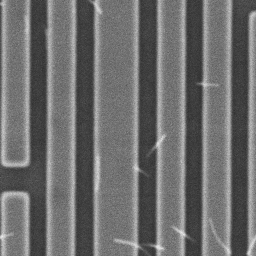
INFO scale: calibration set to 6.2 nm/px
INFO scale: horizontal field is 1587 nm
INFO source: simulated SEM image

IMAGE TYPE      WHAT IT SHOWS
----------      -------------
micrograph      groups of lines, slits or small figures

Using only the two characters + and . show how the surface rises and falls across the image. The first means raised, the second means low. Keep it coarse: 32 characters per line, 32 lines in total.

++++..+++...+++++...+++..++++...
++++..+++...+++++...+++..++++...
++++..+++...+++++...+++..++++..+
++++..+++...+++++...+++..++++..+
++++..+++...+++++...+++..++++..+
++++..+++...+++++...+++..++++..+
++++..+++...+++++...+++..++++..+
++++..+++...+++++...+++..++++..+
++++..+++...+++++...+++..++++..+
++++..+++...+++++...+++..++++..+
++++..+++...+++++...+++..++++..+
++++..+++...+++++...+++..++++..+
++++..+++...+++++...+++..++++..+
++++..+++...+++++...+++..++++..+
++++..+++...+++++...+++..++++..+
++++..+++...+++++...+++..++++..+
++++..+++...+++++...+++..++++..+
++++..+++...+++++...+++..++++..+
++++..+++...+++++...+++..++++..+
++++..+++...+++++...+++..++++..+
.++...+++...+++++...+++..++++..+
......+++...+++++...+++..++++..+
......+++...+++++...+++..++++..+
......+++...+++++...+++..++++..+
+++...+++...+++++...+++..++++..+
++++..+++...+++++...+++..++++..+
++++..+++...+++++...+++..++++..+
++++..+++...+++++...+++..++++..+
++++..+++...+++++...+++..++++..+
++++..+++...+++++...+++..++++..+
++++..+++...+++++...+++..++++..+
++++..+++...+++++...+++..++++..+